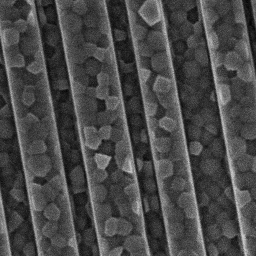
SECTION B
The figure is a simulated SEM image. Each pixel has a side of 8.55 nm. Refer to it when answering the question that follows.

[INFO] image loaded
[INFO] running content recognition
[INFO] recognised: one or a few lines or trenches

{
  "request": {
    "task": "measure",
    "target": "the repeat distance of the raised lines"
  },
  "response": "556 nm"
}